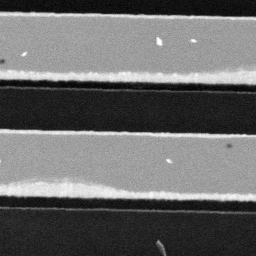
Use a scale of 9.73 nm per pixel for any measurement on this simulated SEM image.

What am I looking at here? lines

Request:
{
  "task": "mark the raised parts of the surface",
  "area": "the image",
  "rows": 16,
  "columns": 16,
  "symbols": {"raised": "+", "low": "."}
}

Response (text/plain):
................
++++++++++++++++
++++++++++++++++
++++++++++++++++
++++++++++++++++
................
................
................
++++++++++++++++
++++++++++++++++
++++++++++++++++
++++++++++++++++
................
................
................
................